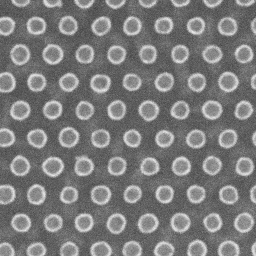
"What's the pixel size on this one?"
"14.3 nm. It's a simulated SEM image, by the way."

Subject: a regular array of raised bodies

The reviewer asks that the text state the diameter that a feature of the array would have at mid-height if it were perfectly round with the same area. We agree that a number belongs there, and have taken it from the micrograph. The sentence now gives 238 nanometers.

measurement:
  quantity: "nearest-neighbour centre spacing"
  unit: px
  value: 31.5